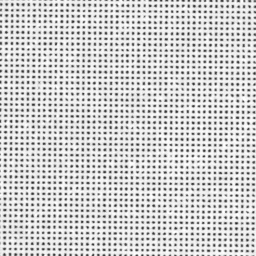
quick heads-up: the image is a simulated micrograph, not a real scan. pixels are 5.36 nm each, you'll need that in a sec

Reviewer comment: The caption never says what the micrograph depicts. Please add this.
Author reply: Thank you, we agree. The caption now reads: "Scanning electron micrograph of a regular array of holes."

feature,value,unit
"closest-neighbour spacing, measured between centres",27.7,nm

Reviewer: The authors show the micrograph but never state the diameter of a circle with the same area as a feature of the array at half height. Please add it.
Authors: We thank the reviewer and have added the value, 0.016 microns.